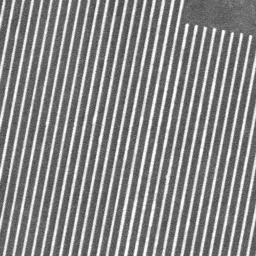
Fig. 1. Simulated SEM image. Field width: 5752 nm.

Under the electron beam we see parallel lines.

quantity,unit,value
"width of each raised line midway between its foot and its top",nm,38.7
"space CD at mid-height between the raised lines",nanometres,168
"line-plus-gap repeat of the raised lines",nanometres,207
